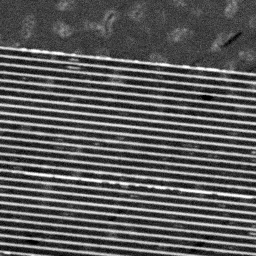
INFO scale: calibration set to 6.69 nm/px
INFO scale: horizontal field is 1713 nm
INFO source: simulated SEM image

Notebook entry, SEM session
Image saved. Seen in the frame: parallel lines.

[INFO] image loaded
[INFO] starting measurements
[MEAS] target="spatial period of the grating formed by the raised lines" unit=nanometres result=54.2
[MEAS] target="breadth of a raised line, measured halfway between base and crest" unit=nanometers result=11.7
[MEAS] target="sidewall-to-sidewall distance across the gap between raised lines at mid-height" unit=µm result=0.0416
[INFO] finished